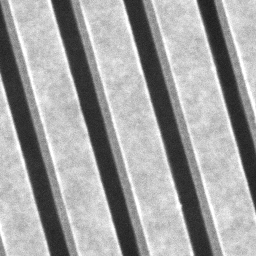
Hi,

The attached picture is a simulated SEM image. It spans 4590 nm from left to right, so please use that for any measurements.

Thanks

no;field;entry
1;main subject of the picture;lines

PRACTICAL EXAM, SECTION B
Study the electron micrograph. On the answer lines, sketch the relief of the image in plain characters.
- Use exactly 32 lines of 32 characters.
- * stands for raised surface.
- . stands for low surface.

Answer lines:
******...*******..*******..*****
*******..*******..*******..*****
.******...******...******..*****
.******...******...******...****
.******...*******..*******..****
..******...******..*******..****
..******...******...******...***
..******...******...*******..***
..*******..*******..*******..***
...******...******...******...**
...******...******...******...**
*..******...******...*******..**
*...******..*******..*******..**
*...******...******...******...*
*...******...******...*******..*
**..*******..*******..*******..*
**...******...******...******..*
**...******...******...******...
**...******...******...*******..
***..*******..*******..*******..
***...******...******...******..
***...******...******...******..
****..*******..*******..*******.
****...******..*******...******.
****...******...******...******.
****...******...*******..*******
*****..*******..*******..*******
*****...******..*******...******
*****...******...******...******
******..*******..******...******
******..*******..*******..******
******...******...******...*****